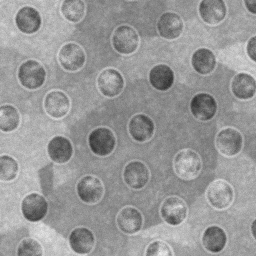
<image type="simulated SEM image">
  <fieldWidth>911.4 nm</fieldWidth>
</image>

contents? a regular array of holes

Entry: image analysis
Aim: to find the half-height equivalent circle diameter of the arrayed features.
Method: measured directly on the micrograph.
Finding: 99.1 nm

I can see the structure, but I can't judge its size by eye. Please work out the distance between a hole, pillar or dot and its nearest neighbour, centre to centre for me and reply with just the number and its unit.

0.16 µm